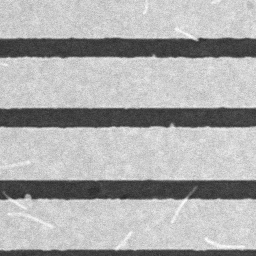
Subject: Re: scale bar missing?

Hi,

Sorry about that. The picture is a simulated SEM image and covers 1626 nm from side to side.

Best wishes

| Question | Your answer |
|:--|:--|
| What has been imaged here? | lines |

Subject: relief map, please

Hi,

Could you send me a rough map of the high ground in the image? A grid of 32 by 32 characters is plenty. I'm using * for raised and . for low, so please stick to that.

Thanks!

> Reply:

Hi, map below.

********************************
********************************
********************************
********************************
********************************
................................
................................
********************************
********************************
********************************
********************************
********************************
********************************
**.........*...*................
................................
................................
********************************
********************************
********************************
********************************
********************************
********************************
...........*....................
................................
................................
********************************
********************************
********************************
********************************
********************************
********************************
................................